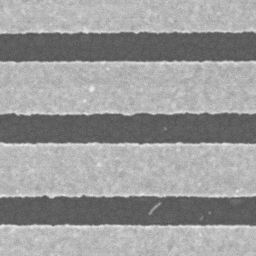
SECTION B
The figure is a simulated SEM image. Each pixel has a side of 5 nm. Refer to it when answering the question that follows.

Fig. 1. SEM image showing lines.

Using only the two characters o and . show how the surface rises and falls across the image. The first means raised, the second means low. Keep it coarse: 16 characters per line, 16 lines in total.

oooooooooooooooo
oooooooooooooooo
................
................
oooooooooooooooo
oooooooooooooooo
oooooooooooooooo
................
................
oooooooooooooooo
oooooooooooooooo
oooooooooooooooo
................
................
oooooooooooooooo
oooooooooooooooo